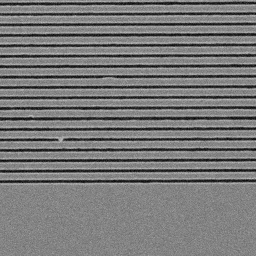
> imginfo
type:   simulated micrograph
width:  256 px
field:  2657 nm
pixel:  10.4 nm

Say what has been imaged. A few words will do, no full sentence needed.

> parallel lines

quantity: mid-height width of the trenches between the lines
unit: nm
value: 38.9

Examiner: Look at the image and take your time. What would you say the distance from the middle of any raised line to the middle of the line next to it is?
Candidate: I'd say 108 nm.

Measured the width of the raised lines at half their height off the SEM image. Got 68.8 nm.